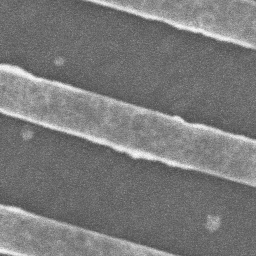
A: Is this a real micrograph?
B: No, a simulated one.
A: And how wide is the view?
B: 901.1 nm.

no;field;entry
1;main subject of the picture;one or a few lines or trenches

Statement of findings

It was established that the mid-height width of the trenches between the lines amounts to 309 nanometers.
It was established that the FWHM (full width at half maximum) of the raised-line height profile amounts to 0.16 micrometres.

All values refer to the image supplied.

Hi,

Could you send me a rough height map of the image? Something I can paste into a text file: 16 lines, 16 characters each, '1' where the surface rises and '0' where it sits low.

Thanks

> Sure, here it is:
0000000111111111
0000000000011111
0000000000000011
0000000000000000
1100000000000000
1111100000000000
1111111100000000
0011111111100000
0000011111111110
0000000011111111
0000000000011111
0000000000000001
0000000000000000
1100000000000000
1111110000000000
1111111110000000